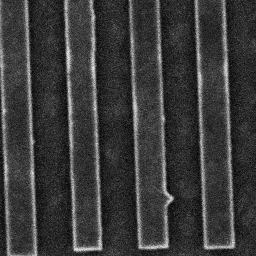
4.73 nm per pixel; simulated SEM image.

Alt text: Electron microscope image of one or a few lines or trenches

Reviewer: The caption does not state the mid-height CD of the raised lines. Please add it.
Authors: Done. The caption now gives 136 nm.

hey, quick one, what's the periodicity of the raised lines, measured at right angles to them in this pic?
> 311 nm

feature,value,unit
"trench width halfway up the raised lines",0.178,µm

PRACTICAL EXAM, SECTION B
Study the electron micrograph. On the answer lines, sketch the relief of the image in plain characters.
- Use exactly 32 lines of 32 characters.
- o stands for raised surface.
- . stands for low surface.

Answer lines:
ooo.....oooo....oooo.....ooo....
ooo.....oooo....oooo.....ooo....
ooo.....oooo....oooo.....ooo....
ooo.....oooo....oooo.....ooo....
ooo.....oooo....oooo.....ooo....
oooo....oooo.....ooo.....ooo....
oooo....oooo....oooo.....ooo....
oooo....oooo....oooo.....ooo....
oooo....oooo.....ooo.....ooo....
oooo....oooo.....ooo.....ooo....
oooo.....ooo.....ooo.....ooo....
oooo.....ooo.....ooo.....ooo....
oooo.....ooo.....ooo.....ooo....
oooo.....ooo.....ooo.....oooo...
oooo.....ooo.....ooo.....oooo...
oooo.....ooo.....ooo.....oooo...
oooo.....ooo.....ooo.....oooo...
oooo.....ooo.....ooo.....oooo...
oooo.....ooo.....oooo....oooo...
.ooo.....ooo.....oooo....oooo...
.ooo.....ooo.....oooo....oooo...
.ooo.....ooo.....oooo....oooo...
.ooo.....ooo.....oooo....oooo...
.ooo.....ooo.....oooo....oooo...
.ooo.....ooo.....oooo....oooo...
.ooo.....ooo.....oooo....oooo...
.ooo.....ooo.....oooo....oooo...
.ooo.....oooo....oooo.....ooo...
.ooo.....oooo....oooo.....ooo...
.ooo.....oooo....oooo.....ooo...
.ooo.....oooo....oooo.....ooo...
.ooo............................